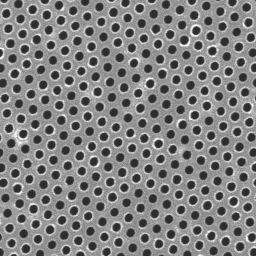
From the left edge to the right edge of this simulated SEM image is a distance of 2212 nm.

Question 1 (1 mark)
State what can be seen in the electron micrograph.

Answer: a regular array of holes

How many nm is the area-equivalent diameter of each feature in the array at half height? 75.5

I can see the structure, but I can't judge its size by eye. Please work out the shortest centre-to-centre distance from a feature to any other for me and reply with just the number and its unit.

130 nm